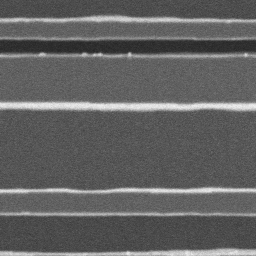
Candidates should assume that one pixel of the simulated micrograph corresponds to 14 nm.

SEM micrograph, lines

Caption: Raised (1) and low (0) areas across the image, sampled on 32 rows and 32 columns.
00000000000000000000000000000000
00000000000000000000000000000000
00000000000000000000000000000000
11111111111111111111111111111111
11111111111111111111111111111111
00000000000000000000000000000000
00000000000000000000000000000000
11111111111111111111111111111111
11111111111111111111111111111111
11111111111111111111111111111111
11111111111111111111111111111111
11111111111111111111111111111111
11111111111111111111111111111111
00000000000000000000000000000000
00000000000000000000000000000000
00000000000000000000000000000000
00000000000000000000000000000000
00000000000000000000000000000000
00000000000000000000000000000000
00000000000000000000000000000000
00000000000000000000000000000000
00000000000000000000000000000000
00000000000000000000000000000000
00000000000000000000000000000000
11111111111111111111111111111111
11111111111111111111111111111111
11111111111111111111111111111111
00000000000000000000000000000000
00000000000000000000000000000000
00000000000000000000000000000000
00000000000000000000000000000000
00000000000000000000000000011100